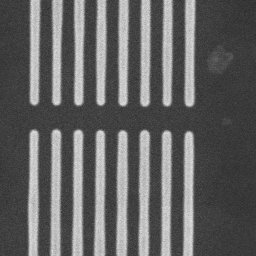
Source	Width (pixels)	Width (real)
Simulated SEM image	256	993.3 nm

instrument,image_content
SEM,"groups of lines, slits or small figures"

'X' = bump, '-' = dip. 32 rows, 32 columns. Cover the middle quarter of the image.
---XX---XX----XX---XX----XX---XX
---XX---XX----XX---XX----XX---XX
---XX---XX----XX---XX----XX---XX
---XX---XX----XX---XX----XX---XX
---XX---XX----XX---XX----XX---XX
---XX---XX----XX---XX----XX---XX
---XX---XX----XX---XX----XX---XX
---XX---XX----XX---XX----XX---XX
---XX---XX----XX---XX----XX---XX
---XX---XX----XX---XX----XX---XX
-------------------------------X
--------------------------------
--------------------------------
--------------------------------
--------------------------------
--------------------------------
--------------------------------
---XX---XX----XX---XX----XX---XX
---XX---XX----XX---XX----XX---XX
---XX---XX----XX---XX----XX---XX
---XX---XX----XX---XX----XX---XX
---XX---XX----XX---XX----XX---XX
---X----XX----XX---XX----XX---XX
---X----XX----XX---XX----XX---XX
---X----XX----XX---XX----XX---XX
---X----XX----XX---XX----XX---XX
---X----XX----XX---XX----XX---XX
---XX---XX---XXX---XX----XX---XX
---XX---XX---XXX---XX----XX---XX
---X----XX---XXX---XX----XX---XX
---X----XX---XXX---XX----XX---XX
---X----XX---XXX---XX----XX---XX